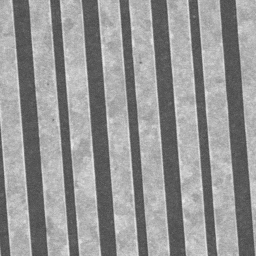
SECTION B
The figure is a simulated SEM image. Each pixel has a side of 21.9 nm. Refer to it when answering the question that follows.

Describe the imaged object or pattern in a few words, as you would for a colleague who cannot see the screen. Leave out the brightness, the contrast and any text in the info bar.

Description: parallel lines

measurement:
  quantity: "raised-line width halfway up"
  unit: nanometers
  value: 446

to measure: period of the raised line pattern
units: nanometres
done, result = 750